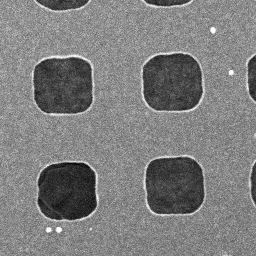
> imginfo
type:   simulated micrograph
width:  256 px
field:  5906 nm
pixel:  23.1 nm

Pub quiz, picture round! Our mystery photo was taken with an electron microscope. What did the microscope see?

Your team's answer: holes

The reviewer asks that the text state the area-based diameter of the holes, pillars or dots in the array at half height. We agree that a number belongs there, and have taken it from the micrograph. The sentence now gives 62.5 pixels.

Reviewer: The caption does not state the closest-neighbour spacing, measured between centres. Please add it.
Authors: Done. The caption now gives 2410 nm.